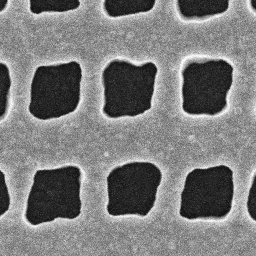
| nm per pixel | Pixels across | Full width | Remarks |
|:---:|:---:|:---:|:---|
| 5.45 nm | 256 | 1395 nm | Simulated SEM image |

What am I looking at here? holes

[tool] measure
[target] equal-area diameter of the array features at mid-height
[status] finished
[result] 308 nm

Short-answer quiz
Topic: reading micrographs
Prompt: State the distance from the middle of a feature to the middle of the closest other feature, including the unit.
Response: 408 nm